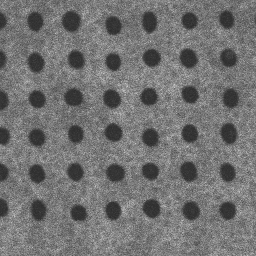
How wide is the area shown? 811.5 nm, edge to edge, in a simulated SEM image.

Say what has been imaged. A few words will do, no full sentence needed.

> a regular array of holes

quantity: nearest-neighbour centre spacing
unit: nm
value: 114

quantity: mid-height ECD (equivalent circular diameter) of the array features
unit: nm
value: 56.3